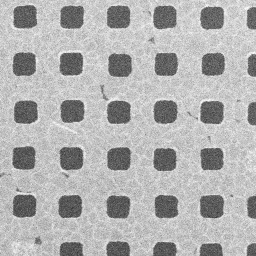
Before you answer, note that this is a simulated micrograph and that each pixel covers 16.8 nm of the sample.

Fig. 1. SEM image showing a regular array of holes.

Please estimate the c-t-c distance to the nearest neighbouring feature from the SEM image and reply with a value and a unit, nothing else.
46.3 pixels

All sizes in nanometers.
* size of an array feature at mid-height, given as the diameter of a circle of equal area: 435